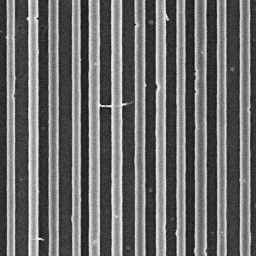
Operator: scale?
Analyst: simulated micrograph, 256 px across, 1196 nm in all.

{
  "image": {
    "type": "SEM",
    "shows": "parallel lines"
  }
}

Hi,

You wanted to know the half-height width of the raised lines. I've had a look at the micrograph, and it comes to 9.12 px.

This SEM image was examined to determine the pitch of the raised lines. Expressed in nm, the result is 99.6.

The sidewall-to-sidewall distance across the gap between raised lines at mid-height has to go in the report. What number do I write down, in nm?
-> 54.9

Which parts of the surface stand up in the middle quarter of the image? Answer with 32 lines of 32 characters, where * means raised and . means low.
..**...**...**....**...**...**..
..**..***...**....**...**...**..
..**..***...**....**...**...**..
..**..***...**....**...**...**..
..**..***...**....**...**...**..
..**..***...**....**...**...**..
..**..***...**....**...**...**..
..**..***...**....**...**...**..
..**..***...**....**...**...**..
..**..***...***...**...**...**..
..**..***...***...**...**...**..
..**..***...**....**...**...**..
..**...**...**....**...**...**..
..**..***...**....**...**...**..
..**..***...**....**...**...**..
..**..***...**....**...**...**..
..**..***...**....**...**...**..
..**..***...**....**...**...**..
..**...**...**....**...**...**..
..**...**...**....**...**...**..
..**...**...**....**...**...**..
..**..***...**....**...**...**..
..**..***...**....**...**...**..
..**...**...**....**...**...**..
..**...**...**....**...**...**..
..**...**...**....**...**...**..
..**..***...**....**...**...**..
..**..***...**....**...**...**..
..**..***...**....**...**...**..
..**..***...**....**...**...**..
..**...**...**....**...**...**..
..**...**...**....**...**...**..